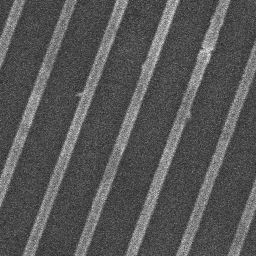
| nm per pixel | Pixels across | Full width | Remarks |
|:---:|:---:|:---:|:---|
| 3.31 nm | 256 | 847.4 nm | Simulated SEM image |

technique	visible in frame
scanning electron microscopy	parallel lines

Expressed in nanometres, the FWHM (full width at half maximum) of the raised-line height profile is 29.1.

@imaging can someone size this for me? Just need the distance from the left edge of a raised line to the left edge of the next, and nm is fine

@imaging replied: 159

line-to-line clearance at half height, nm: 129